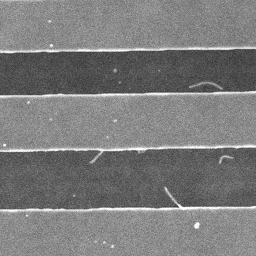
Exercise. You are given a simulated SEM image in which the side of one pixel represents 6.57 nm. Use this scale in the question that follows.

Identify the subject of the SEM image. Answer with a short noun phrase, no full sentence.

lines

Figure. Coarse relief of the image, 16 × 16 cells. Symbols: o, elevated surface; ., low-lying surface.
oooooooooooooooo
oooooooooooooooo
oooooooooooooooo
................
................
................
oooooooooooooooo
oooooooooooooooo
oooooooooooooooo
................
................
................
................
oooooooooooooooo
oooooooooooooooo
oooooooooooooooo